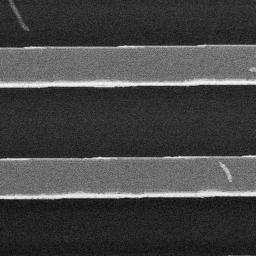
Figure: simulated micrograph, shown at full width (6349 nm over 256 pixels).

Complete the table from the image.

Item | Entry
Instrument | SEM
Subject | lines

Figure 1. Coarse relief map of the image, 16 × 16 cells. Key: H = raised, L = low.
LLLLLLLLLLLLLLLL
LLLLLLLLLLLLLLLL
LLLLLLLLLLLLLLLL
HHHHHHHHHHHHHHHH
HHHHHHHHHHHHHHHH
LLLLLLLLLLLLLLLL
LLLLLLLLLLLLLLLL
LLLLLLLLLLLLLLLL
LLLLLLLLLLLLLLLL
LLLLLLLLLLLLLLLL
HHHHHHHHHHHHHHHH
HHHHHHHHHHHHHHHH
LLLLLLLLLLLLLLLL
LLLLLLLLLLLLLLLL
LLLLLLLLLLLLLLLL
LLLLLLLLLLLLLLLL